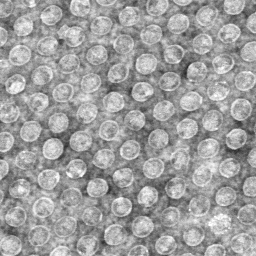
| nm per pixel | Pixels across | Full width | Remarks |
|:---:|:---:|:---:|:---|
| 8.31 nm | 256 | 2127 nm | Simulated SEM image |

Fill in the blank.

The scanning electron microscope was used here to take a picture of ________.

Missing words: a regular array of raised bodies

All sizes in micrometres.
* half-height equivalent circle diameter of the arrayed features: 0.165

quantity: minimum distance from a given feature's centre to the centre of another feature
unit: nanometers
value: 234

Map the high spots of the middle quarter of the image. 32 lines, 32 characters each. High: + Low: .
++++........+++...+++++........+
+++.........++++..++++.........+
......+....+++++....+....+++...+
.....++++..++++.........+++++..+
....+++++...++..........+++++...
++..+++++.........++++..++++....
++...+++.........+++++...++.....
++.........+++...+++++.........+
+.........+++++..++++........+++
..........+++++.........++...+++
....++++..+++++........++++..+++
....++++...+++.........++++....+
...+++++........+++....++++.....
+..++++........+++++...+++......
+...++.....+...+++++.........+++
+........++++...++++.........+++
.........++++....++....++...++++
..++++...++++.........++++...+++
..+++++...++.........+++++....+.
..+++++........+++...+++++......
..+++++........++++...+++.......
...++....++...+++++.........++..
........++++..+++++........++++.
.......++++++..+++.........++++.
..+++..+++++.........++++..++++.
.++++...+++.........+++++..++++.
.+++++........+++...+++++.......
.++++.......+++++...++++........
..+.........+++++...............
......++++..+++++.........++++..
......+++++...++..........++++..
.++...+++++.........+++...++++..